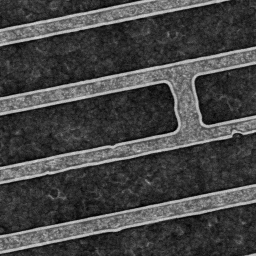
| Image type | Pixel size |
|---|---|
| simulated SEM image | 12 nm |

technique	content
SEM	one or a few lines or trenches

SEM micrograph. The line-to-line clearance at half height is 640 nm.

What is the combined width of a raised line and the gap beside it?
809 nm